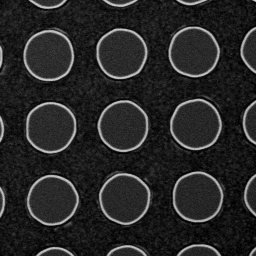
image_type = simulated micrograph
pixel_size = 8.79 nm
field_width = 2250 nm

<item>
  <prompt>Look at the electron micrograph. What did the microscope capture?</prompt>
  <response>an array of small figures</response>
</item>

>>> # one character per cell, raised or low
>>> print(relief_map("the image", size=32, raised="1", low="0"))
00001111000000110000000110000000
00000000000000000000000000000000
00000000000000000000000000000000
00000000000000000000000110000000
00001111000001111000001111100001
00011111100011111100011111100011
00011111100011111100011111100011
00011111100011111100011111100011
00011111100001111100001111100001
00001111000000110000000110000000
00000000000000000000000000000000
00000000000000000000000000000000
00000000000000000000000010000000
00001111000001111100001111100001
00011111100001111100001111100011
00011111100011111100011111110011
00011111100011111100011111100001
00011111100001111100001111100001
00001111000000111000000111000000
00000000000000000000000000000000
00000000000000000000000000000000
00000000000000000000000000000000
00000111000000111100001111100001
00001111100001111110001111110001
10011111110011111110001111110001
10011111110001111110001111110001
00001111100001111100001111100001
00000111000000111000000111000000
00000000000000000000000000000000
00000000000000000000000000000000
00000000000000000000000000000000
00000111100000111100000111100001